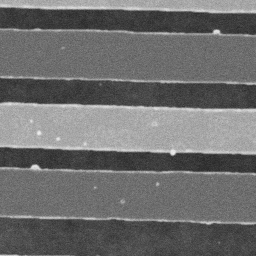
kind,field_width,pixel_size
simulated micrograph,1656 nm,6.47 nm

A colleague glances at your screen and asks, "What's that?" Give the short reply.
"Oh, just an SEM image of lines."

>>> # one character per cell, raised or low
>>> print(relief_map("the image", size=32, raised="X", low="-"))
XXXXXXXXXXXXXXXXXXXXXXXXXXXXXXXX
--------------------------XXXXXX
--------------------------------
--------------------------------
XXXXXXXXXXXXXXXXXXXXXXXXXXXXXXXX
XXXXXXXXXXXXXXXXXXXXXXXXXXXXXXXX
XXXXXXXXXXXXXXXXXXXXXXXXXXXXXXXX
XXXXXXXXXXXXXXXXXXXXXXXXXXXXXXXX
XXXXXXXXXXXXXXXXXXXXXXXXXXXXXXXX
XXXXXXXXXXXXXXXXXXXXXXXXXXXXXXXX
------------------------------XX
--------------------------------
--------------------------------
XXXXXXXXXXXXXXXXXXXXXX----------
XXXXXXXXXXXXXXXXXXXXXXXXXXXXXXXX
XXXXXXXXXXXXXXXXXXXXXXXXXXXXXXXX
XXXXXXXXXXXXXXXXXXXXXXXXXXXXXXXX
XXXXXXXXXXXXXXXXXXXXXXXXXXXXXXXX
-----XXXXXXXXXXXXXXXXXXXXXXXXXXX
--------------------------------
--------------------------------
XXXXXXXXXXXXXXXXXXXXXXXX--------
XXXXXXXXXXXXXXXXXXXXXXXXXXXXXXXX
XXXXXXXXXXXXXXXXXXXXXXXXXXXXXXXX
XXXXXXXXXXXXXXXXXXXXXXXXXXXXXXXX
XXXXXXXXXXXXXXXXXXXXXXXXXXXXXXXX
XXXXXXXXXXXXXXXXXXXXXXXXXXXXXXXX
---------------XXXXXXXXXXXXXXXXX
--------------------------------
--------------------------------
--------------------------------
--------------------------------